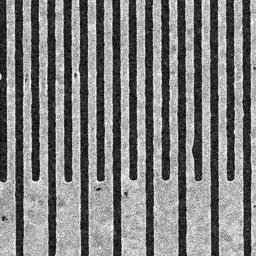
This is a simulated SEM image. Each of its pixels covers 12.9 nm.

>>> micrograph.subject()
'parallel lines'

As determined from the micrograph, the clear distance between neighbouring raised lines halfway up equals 108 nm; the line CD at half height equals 102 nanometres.